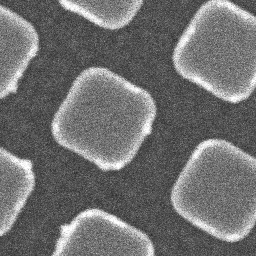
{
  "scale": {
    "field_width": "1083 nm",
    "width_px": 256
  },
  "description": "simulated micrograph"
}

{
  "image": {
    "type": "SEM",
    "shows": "raised bodies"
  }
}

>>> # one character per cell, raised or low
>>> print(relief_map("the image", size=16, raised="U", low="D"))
DDDDUUUUUDDDDUUD
UUDDDDUUDDDDUUUU
UUDDDDDDDDDUUUUU
UUDDDDDDDDDUUUUU
UDDDDUUDDDDUUUUU
UDDDDUUUUDDDDUUU
DDDDUUUUUUDDDDDD
DDDUUUUUUUDDDDDD
DDDUUUUUUDDDDDDD
DDDDDUUUDDDDUUUD
UUDDDDUDDDDDUUUU
UUDDDDDDDDDUUUUU
UUDDDDDDDDDUUUUU
UDDDDUUDDDDUUUUU
DDDDUUUUUDDDDUUD
DDDUUUUUUUDDDDDD